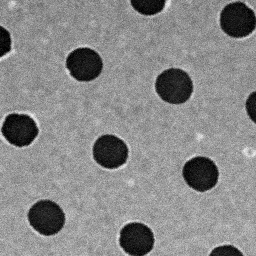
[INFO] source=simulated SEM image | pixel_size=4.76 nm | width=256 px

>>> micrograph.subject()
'holes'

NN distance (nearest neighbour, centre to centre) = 435 nm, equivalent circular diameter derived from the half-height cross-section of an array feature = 36.6 px